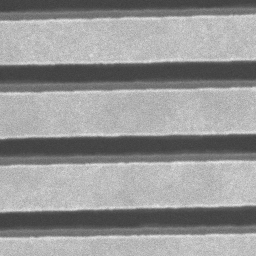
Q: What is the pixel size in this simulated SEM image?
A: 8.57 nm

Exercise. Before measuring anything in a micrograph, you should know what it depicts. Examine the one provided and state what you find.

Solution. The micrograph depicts lines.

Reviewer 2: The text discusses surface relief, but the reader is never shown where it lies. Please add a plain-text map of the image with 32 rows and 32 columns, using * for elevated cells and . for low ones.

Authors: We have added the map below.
................................
........************************
********************************
********************************
********************************
********************************
********************************
********************************
................................
................................
********************************
********************************
********************************
********************************
********************************
********************************
********************************
................................
................................
............*..*****************
********************************
********************************
********************************
********************************
********************************
********************************
................................
................................
..................*..*..********
********************************
********************************
********************************